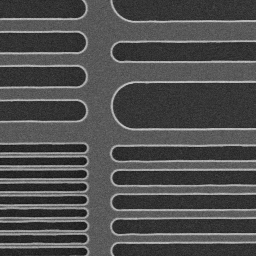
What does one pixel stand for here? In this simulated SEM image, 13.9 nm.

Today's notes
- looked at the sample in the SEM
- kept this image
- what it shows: groups of lines, slits or small figures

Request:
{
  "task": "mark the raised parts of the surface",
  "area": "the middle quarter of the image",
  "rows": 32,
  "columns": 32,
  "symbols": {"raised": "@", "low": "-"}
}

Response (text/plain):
----@@@@@@@@@@@@@@@@@@@@@@@@@@@@
-----@@@@@@@@@@@@@@@@@@@@@@@@@@@
------@@@@@@@@@@@@@@@@@@@@@@@@@@
------@@@@@@@@@@@@@@@@@@@@@@@@@@
-----@@@@@@@@@@@@@--------------
----@@@@@@@@@@@-----------------
@@@@@@@@@@@@@@------------------
@@@@@@@@@@@@@-------------------
@@@@@@@@@@@@--------------------
----@@@@@@@@--------------------
-----@@@@@@@--------------------
------@@@@@@--------------------
------@@@@@@--------------------
-----@@@@@@@@-------------------
@@@@@@@@@@@@@@------------------
@@@@@@@@@@@@@@@-----------------
@@@@@@@@@@@@@@@@@@---@@@--@@----
@@@@@@@@@@@@@@@@@@@@@@@@@@@@@@@@
@@@@@@@@@@@@@@@@@@@@@@@@@@@@@@@@
@@@@@@@@@@@@@@@@@@@@@@@@@@@@@@@@
------@@@@@@@-------------------
------@@@@@@--------------------
@@@@@@@@@@@@--------------------
------@@@@@@--------------------
------@@@@@@@@@@@@@@@@@@@@@@@@@@
-----@@@@@@@@@@@@@@@@@@@@@@@@@@@
-----@@@@@@@@-------------------
------@@@@@@--------------------
-----@@@@@@@--------------------
-----@@@@@@@--------------------
------@@@@@@@@@@@@@@@@@@@@@@@@@@
------@@@@@@@@@@@@@@@@@@@@@@@@@@